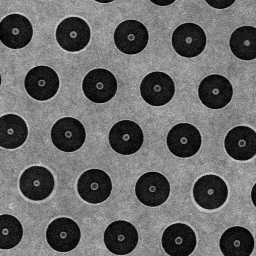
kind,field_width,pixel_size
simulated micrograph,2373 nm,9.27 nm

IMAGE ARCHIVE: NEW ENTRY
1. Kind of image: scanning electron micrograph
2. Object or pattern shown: an array of small figures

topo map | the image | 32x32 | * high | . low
*******************..*****...***
********************************
....****...*****.***************
....***....****...****...*****..
....***....***.....***....***...
....***....***....****....***...
*********.*****...****...****...
******************************.*
****..**************************
***....****...****...*****..****
***.....**.....***....***....***
***....***.....***....***....***
****..*****...****...****....***
**************************..****
..******************************
...****...****...*****..********
....**.....***....***....****...
...***.....***....***....***....
..*****...****....***....***....
**********************..*****...
********************************
***...****...******.************
**.....***....***....****...****
**.....***....***....***.....***
***...****....***....***.....**.
******************..*****...****
********************************
..*****..***********************
...***....***....****...*****..*
...***....***....***.....***....
..****....***....***.....**.....
**************..*****...****...*